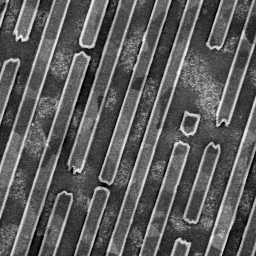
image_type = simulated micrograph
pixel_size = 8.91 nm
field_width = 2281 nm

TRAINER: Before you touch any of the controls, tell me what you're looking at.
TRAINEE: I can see parallel lines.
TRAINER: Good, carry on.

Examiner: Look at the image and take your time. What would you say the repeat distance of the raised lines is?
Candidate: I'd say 279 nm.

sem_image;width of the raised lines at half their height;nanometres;124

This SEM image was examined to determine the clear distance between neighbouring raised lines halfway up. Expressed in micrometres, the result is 0.159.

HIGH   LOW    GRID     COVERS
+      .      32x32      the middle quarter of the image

..++++...++++.....+++.....+++...
..+++....+++.....++++....++++...
.++++...++++.....++++....++++...
.++++...++++.....+++.....+++....
.+++....+++.....++++.....+++....
++++...++++.....++++....++++....
++++...++++.....+++.....+++.....
+++....++++....++++.....+++.....
+++...++++.....++++....++++.....
+++...++++.....+++.....+++......
+++...++++.....+++.....+++......
++...++++.....++++....++++......
++...++++.....++++....+++.....+.
++...++++.....+++.....+++.....++
+...++++.....++++....++++.....++
+...++++.....++++....+++.....+++
+...++++.....+++.....+++.....+++
...++++.....++++....++++......++
...++++.....++++....+++.........
...++++.....+++.....+++.........
..++++.....++++....++++.....+++.
..++++.....++++....+++.....++++.
..++++.....+++.....+++.....++++.
..+++.....++++....++++.....+++..
.++++.....++++....+++.....++++..
.++++.....+++.....+++.....++++..
..++.....++++....++++.....+++...
.........++++....++++....++++...
.........+++.....+++.....++++...
..........++.....+++.....+++....
................++++.....+++....
........+++.....+++.....++++....